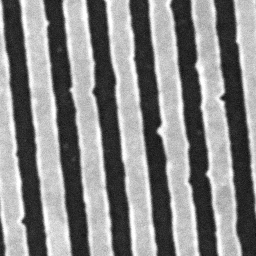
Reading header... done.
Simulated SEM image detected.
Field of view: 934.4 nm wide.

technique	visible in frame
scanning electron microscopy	parallel lines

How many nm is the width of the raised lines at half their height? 72.6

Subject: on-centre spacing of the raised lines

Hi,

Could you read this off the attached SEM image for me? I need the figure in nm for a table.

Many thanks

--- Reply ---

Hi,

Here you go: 155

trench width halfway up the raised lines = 82.6 nanometers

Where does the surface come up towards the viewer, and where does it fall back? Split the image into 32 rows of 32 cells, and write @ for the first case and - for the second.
---@@---@@----@@---@@---@@@--@@@
---@@---@@@---@@---@@---@@@---@@
---@@@--@@@---@@---@@@--@@@---@@
---@@@--@@@---@@---@@@--@@@---@@
---@@@---@@---@@---@@@---@@---@@
@--@@@---@@---@@@--@@@---@@---@@
@--@@@---@@---@@@--@@@---@@---@@
@---@@---@@---@@----@@---@@---@@
@---@@---@@@--@@@---@@---@@---@@
@---@@---@@@---@@---@@---@@@--@@
@---@@---@@@---@@---@@---@@@--@@
@---@@---@@----@@---@@---@@@---@
@---@@@--@@@---@@---@@@--@@@---@
@---@@@---@@---@@---@@@--@@@---@
@---@@@---@@---@@@--@@@---@@---@
@@--@@@---@@---@@@--@@@---@@---@
@@---@@---@@---@@@--@@@---@@---@
@@---@@---@@---@@@---@@---@@@--@
@@---@@---@@@--@@@---@@---@@@--@
@@---@@---@@@--@@@---@@---@@@--@
@@---@@---@@@---@@---@@---@@@---
@@---@@---@@@---@@---@@@--@@@---
@@---@@@--@@@---@@---@@---@@@---
@@---@@@---@@---@@@--@@@---@@---
@@@--@@@---@@---@@@---@@---@@---
@@@--@@@---@@---@@@---@@---@@---
@@@---@@---@@---@@@---@@---@@---
@@@---@@---@@@--@@@---@@---@@---
-@@---@@---@@@---@@---@@---@@---
-@@---@@---@@@---@@---@@---@@---
-@@---@@@--@@@---@@---@@@--@@@--
-@@---@@@--@@@---@@---@@@--@@@--